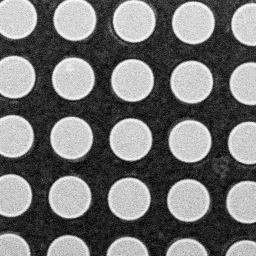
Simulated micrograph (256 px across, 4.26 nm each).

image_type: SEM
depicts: an array of small figures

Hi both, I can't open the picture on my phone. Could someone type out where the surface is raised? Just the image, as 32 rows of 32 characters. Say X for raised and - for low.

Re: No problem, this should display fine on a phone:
XXXX----XXX----XXX-----XX------X
XXXX---XXXXX--XXXXX---XXXX---XXX
XXXXX--XXXXX--XXXXX---XXXXX--XXX
XXXX---XXXXX--XXXXX---XXXXX--XXX
-XX-----XXX----XXXX---XXXX---XXX
-------------------------------X
--------------------------------
XXX-----XX------X---------------
XXXX---XXXX---XXXXX---XXXX----XX
XXXX---XXXXX--XXXXX--XXXXX---XXX
XXXX---XXXXX--XXXXX--XXXXXX--XXX
XXXX---XXXX---XXXXX---XXXX---XXX
----------------X------XX-----XX
--------------------------------
-X------------------------------
XXXX---XXXX----XXX----XXX-----XX
XXXX--XXXXX---XXXXX--XXXXX---XXX
XXXX--XXXXXX--XXXXX--XXXXX---XXX
XXXX---XXXX---XXXXX--XXXXX---XXX
XX------XX-----XXX----XXXX---XXX
--------------------------------
--------------------------------
XXX----XXX-----XX------X--------
XXXX--XXXXX---XXXX---XXXXX---XXX
XXXX--XXXXX---XXXXX--XXXXX--XXXX
XXXX--XXXXX---XXXXX--XXXXX--XXXX
XXX----XXXX---XXXX---XXXXX---XXX
-----------------------X------XX
--------------------------------
XX------X-----------------------
XXX---XXXXX---XXXX----XXX----XXX
XXXX--XXXXX--XXXXX---XXXXX--XXXX